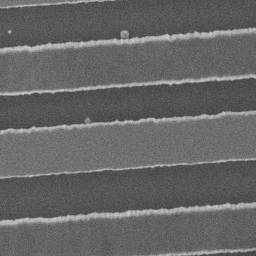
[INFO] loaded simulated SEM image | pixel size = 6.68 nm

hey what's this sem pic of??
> lines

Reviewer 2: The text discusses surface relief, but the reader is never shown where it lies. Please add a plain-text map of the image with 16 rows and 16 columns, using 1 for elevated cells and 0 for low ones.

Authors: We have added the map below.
0000000000000000
0000000000000000
0000000111111111
1111111111111111
1111111111111111
1111111000000000
0000000000000000
0000000001111111
1111111111111111
1111111111111111
1111111110000000
0000000000000000
0000000000000000
0000011111111111
1111111111111111
1111111111111111